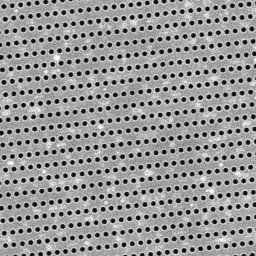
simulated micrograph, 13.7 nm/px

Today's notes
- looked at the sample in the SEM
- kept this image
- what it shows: a regular array of holes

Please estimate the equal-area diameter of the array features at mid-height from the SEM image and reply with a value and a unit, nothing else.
67.1 nm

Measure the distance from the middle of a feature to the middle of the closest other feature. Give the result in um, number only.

0.113